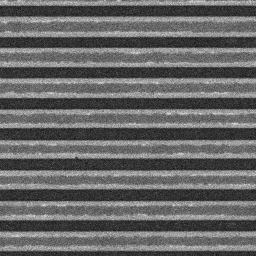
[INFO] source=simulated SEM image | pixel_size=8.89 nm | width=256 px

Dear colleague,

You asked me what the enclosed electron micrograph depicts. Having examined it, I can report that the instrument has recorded parallel lines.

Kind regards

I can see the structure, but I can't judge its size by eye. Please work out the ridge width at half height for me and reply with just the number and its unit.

14.6 px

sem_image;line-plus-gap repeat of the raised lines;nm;272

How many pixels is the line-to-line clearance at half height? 16.3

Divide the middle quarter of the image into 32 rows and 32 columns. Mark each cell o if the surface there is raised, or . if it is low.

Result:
................................
................................
................................
................................
oooooooooooooooooooooooooooooooo
oooooooooooooooooooooooooooooooo
oooooooooooooooooooooooooooooooo
oooooooooooooooooooooooooooooooo
................................
................................
................................
................................
oooooooooooooooooooooooooooooooo
oooooooooooooooooooooooooooooooo
oooooooooooooooooooooooooooooooo
................................
................................
................................
................................
................................
oooooooooooooooooooooooooooooooo
oooooooooooooooooooooooooooooooo
oooooooooooooooooooooooooooooooo
................................
................................
................................
................................
ooooooooooooooooo.....oooooooooo
oooooooooooooooooooooooooooooooo
oooooooooooooooooooooooooooooooo
ooooooooooooooooooooooooooooooo.
................................